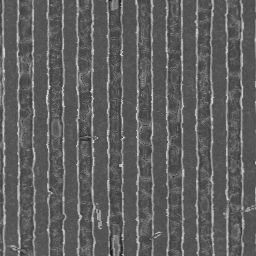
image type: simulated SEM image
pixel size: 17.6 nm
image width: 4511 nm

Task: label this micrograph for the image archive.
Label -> parallel lines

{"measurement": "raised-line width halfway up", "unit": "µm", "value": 0.282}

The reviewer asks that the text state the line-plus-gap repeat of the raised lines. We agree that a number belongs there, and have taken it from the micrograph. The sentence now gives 525 nanometres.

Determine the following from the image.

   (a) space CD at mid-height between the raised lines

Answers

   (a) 247 nm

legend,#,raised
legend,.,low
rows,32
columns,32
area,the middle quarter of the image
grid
###....####...####....####....##
###....####....###....####....##
###....####....###....####....##
###....####....###....####....##
###....####....####...####...###
###....####....###....####...###
###....####....####...####...###
####...####....####...####....##
####...####....###....####....##
####...####...####....####....##
####...####...####....####....##
####...####...####....####...###
####...####...####....####...###
####...####...####....####....##
###....####....###....####...###
###....####....###....####...###
###....####....###....####....##
###....####...####....####....##
###....####....###....####....##
###....####....###....####....##
###....####....###....####....##
###....####...#####...####....##
###....####...#####...####....##
###....####....###....####...###
###....####....###....####...###
###....####...#####...####....##
###....####....####...####....##
###....####...#####...####....##
###....####....####...####....##
####...####....###....####....##
####...####...####....####....##
####...####...####....####....##